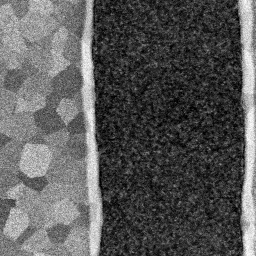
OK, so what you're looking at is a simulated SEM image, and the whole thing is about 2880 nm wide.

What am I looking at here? one or a few lines or trenches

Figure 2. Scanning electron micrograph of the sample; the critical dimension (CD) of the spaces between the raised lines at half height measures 1790 nm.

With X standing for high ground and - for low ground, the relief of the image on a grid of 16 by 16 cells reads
XXXXXX---------X
XXXXXX---------X
XXXXX----------X
XXXXX----------X
XXXXX-----------
XXXXX-----------
XXXXXX----------
XXXXXX----------
XXXXXX----------
XXXXXX----------
XXXXXX----------
XXXXXX---------X
XXXXXX---------X
XXXXXX----------
XXXXXX----------
XXXXXX----------